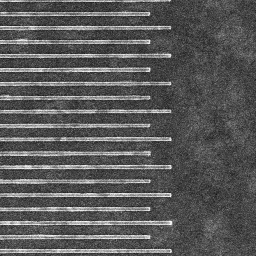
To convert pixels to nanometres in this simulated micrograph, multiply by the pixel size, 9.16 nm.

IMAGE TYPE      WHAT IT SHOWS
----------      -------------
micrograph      parallel lines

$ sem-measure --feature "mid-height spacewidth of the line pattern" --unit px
10.7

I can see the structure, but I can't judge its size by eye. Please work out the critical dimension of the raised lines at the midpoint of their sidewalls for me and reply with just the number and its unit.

30.9 nm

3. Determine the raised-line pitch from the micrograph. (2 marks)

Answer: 128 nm